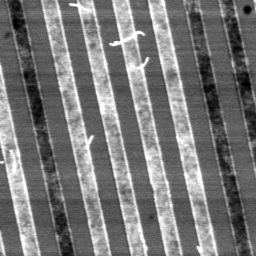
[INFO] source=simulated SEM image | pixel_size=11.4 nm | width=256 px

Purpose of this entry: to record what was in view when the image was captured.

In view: parallel lines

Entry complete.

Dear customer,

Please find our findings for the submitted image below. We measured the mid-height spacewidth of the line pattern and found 228 nanometres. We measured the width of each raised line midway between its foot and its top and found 164 nanometers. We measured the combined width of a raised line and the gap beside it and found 397 nm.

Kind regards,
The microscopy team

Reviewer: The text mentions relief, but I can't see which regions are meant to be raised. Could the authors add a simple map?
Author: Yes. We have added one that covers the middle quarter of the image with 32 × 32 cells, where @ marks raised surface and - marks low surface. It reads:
@@-----@@@------@@@@-----@@@----
@@-----@@@@-----@@@@-----@@@----
@@-----@@@@-----@@@@-----@@@@---
@@-----@@@@-----@@@@-----@@@@---
@@------@@@------@@@-----@@@@---
@@@-----@@@@-----@@@@-----@@@---
@@@-----@@@@-----@@@@-----@@@---
@@@-----@@@@-----@@@@-----@@@@--
@@@-----@@@@-----@@@@-----@@@@--
@@@------@@@------@@@------@@@--
@@@@-----@--@-----@@@@-----@@@--
@@@@-----@-@@-----@@@@-----@@@@-
-@@@-----@@@@-----@@@@-----@@@@-
-@@@------@@@-----@@@@-----@@@@-
-@@@@-----@@@------@@@------@@@-
-@@@@-----@@@@-----@@@------@@@-
-@@@@-----@@@@-----@@@@-----@@@@
--@@@------@@@-----@@@@-----@@@@
--@@@@-----@@@-----@@@@-----@@@@
--@@@@-----@@@@-----@@@------@@@
--@@@@-----@@@@-----@@@------@@@
--@@@@-----@@@@-----@@@@-----@@@
---@@@------@@@-----@@@@-----@@@
---@@@@-----@@@------@@@-----@@@
---@@@@-----@@@@-----@@@-----@@@
---@@@@-----@@@@-----@@@@-----@@
---@@@@-----@@@@-----@@@@-----@@
----@@@------@@@-----@@@@-----@@
----@@@------@@@------@@@------@
----@@@@-----@@@@-----@@@@-----@
----@@@@-----@@@@-----@@@@-----@
-----@@@------@@@-----@@@@-----@